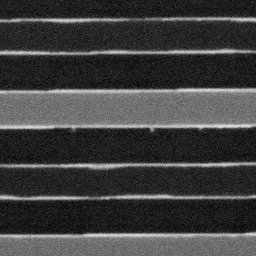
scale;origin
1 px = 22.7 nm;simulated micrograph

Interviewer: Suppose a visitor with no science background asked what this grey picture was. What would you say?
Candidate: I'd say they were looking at lines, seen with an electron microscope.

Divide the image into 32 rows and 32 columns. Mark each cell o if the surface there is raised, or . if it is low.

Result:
................................
................................
...........ooooooooooooooooooooo
oooooooooooooooooooooooooooooooo
oooooooooooooooooooooooooooooooo
oooooooooooooooooooooooooooooooo
oooooooooooooo...ooo............
................................
................................
................................
................................
oooooooooooooooooooooooooooooooo
oooooooooooooooooooooooooooooooo
oooooooooooooooooooooooooooooooo
oooooooooooooooooooooooooooooooo
oooooooooooooooooooooooooooooooo
................................
................................
................................
................................
................................
oooooooooooooooooooooooooooooooo
oooooooooooooooooooooooooooooooo
oooooooooooooooooooooooooooooooo
oooooooooooooooooooooooooooooooo
................................
................................
................................
................................
oooooooooooooooooooooooooooooooo
oooooooooooooooooooooooooooooooo
oooooooooooooooooooooooooooooooo